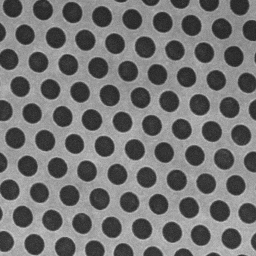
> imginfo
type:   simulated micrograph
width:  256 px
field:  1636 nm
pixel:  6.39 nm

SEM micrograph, a regular array of holes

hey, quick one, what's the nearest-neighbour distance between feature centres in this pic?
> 188 nm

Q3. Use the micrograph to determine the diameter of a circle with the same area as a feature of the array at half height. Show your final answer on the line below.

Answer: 20.9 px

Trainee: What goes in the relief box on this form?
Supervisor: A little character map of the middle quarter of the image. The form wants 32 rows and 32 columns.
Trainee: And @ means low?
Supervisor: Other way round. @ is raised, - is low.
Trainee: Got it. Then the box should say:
----@@-----@@@----@@@@---@@@@@@@
---@@@-----@@------@@-----@@@---
---@@@@----@@@-----@@-----@@----
@@@@@@@@--@@@@----@@@-----@@----
@@@--@@@@@@@@@@@@@@@@@---@@@@---
@@----@@@@---@@@@@@@@@@@@@@@@---
@-----@@@-----@@@----@@@@@@@@@@@
@------@@-----@@@----@@@----@@@@
@@----@@@-----@@@-----@@-----@@@
@@@--@@@@@----@@@-----@@-----@@-
@@@@@@@@@@@--@@@@@---@@@-----@@-
--@@@@--@@@@@@@@@@@@@@@@@---@@@@
--@@@----@@@@---@@@@@@@@@@@@@@@@
--@@------@@-----@@@----@@@@@@@@
--@@------@@-----@@-----@@@----@
-@@@@----@@@-----@@@-----@@-----
@@@@@@--@@@@@----@@@----@@@-----
@@-@@@@@@@@@@@@@@@@@@---@@@-----
@----@@@----@@@@@@@@@@@@@@@@---@
-----@@@----@@@@---@@@@@@-@@@@@@
-----@@------@@-----@@@----@@@@@
@----@@@-----@@-----@@@----@@@--
@@--@@@@----@@@-----@@@-----@@--
@@@@@@@@@@@@@@@@----@@@----@@@--
@@@@---@@@@@@@@@@@@@@@@@--@@@@@-
-@@@----@@@@---@@@@@@@@@@@@@@@@@
-@@-----@@@-----@@@---@@@@@--@@@
@@@-----@@@-----@@-----@@@----@@
@@@@----@@@-----@@-----@@@-----@
@@@@@-@@@@@@---@@@-----@@@-----@
---@@@@@@@@@@@@@@@@---@@@@----@@
---@@@@---@@@@@@@@@@@@@@@@@--@@@